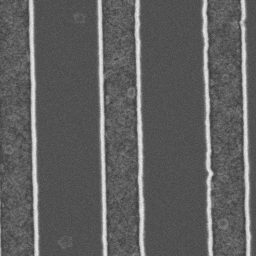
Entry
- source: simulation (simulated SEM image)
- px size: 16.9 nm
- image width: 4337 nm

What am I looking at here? one or a few lines or trenches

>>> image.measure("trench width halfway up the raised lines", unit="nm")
614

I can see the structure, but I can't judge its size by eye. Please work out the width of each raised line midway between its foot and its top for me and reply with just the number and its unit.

1180 nanometers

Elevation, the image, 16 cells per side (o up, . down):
..oooo...oooo..o
..oooo...oooo..o
..oooo...oooo..o
..oooo...oooo..o
..oooo...oooo..o
..oooo...oooo..o
..oooo...oooo..o
..oooo...oooo..o
..oooo...oooo..o
..oooo...oooo..o
..oooo...oooo..o
..oooo...oooo..o
..oooo...oooo..o
..ooooo..oooo..o
..ooooo..oooo..o
..ooooo..oooo..o